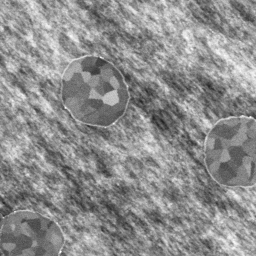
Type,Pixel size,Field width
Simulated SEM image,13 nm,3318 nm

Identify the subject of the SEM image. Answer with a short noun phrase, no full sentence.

raised bodies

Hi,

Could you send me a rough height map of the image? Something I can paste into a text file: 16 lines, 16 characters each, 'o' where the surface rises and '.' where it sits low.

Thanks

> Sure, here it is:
................
................
................
................
....oooo........
....oooo........
....oooo........
.....oo.......oo
.............ooo
.............ooo
.............ooo
..............oo
................
ooo.............
oooo............
oooo............